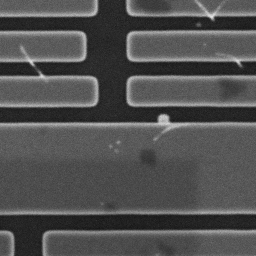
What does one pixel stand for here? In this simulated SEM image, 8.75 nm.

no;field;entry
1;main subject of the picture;groups of lines, slits or small figures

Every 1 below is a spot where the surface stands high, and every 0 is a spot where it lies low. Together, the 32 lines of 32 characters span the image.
11111111111100001111111111111111
11111111111100001111111111111111
00000000000000000000000000000000
00000000000000000000000000000000
11111111111000001111111111111111
11111111111000001111111111111111
11111111111000001111111111111111
11111111110000001111111111111111
00000000000000000000000000000000
00000100000000000000000000000000
11111111111100001111111111111111
11111111111100001111111111111111
11111111111100001111111111111111
00000000000000000000000000000000
00000000000000000000000000000000
11111111111111111111111111111111
11111111111111111111111111111111
11111111111111111111111111111111
11111111111111111111111111111111
11111111111111111111111111111111
11111111111111111111111111111111
11111111111111111111111111111111
11111111111111111111111111111111
11111111111111111111111111111111
11111111111111111111111111111111
11111111111111111111111111111111
11111111111111111111111111111111
00000000000000000000000000000000
00000000000000000000000000000000
11000111111111111111111111111111
11000111111111111111111111111111
11000111111111111111111111111111